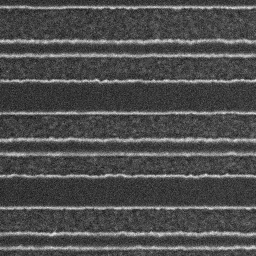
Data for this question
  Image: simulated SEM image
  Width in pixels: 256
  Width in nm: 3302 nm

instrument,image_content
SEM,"lines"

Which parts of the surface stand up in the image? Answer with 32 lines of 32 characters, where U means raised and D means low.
UUUUUUUUUUUUUUUUUUUUUUUUUUUUUUUU
DDDDDDDDDDDDDDDDDDDDDDDDDDDDDDDD
DDDDDDDDDDDDDDDDDDDDDDDDDDDDDDDD
DDDDDDDDDDDDDDDDDDDDDDDDDDDDDDDD
DDDDDDDDDDDDDDDDDDDDDDDDDDDDDDDD
UUUUUUUUUUUUUUUUUUUUUUUUUUUUUUUU
UUUUUUUUUUUUUUUUUUUUUUUUUUUUUUUU
DDDDDDDDDDDDDDDDDDDDDDDDDDDDDDDD
DDDDDDDDDDDDDDDDDDDDDDDDDDDDDDDD
DDDDDDDDDDDDDDDDDDDDDDDDDDDDDDDD
UUUUUUUUUUUUUUUUUUUUUUUUUUUUUUUU
UUUUUUUUUUUUUUUUUUUUUUUUUUUUUUUU
UUUUUUUUUUUUUUUUUUUUUUUUUUUUUUUU
UUUUUUUUUUUUUUUUUUUUUUUUUUUUUUUU
DDDDDDDDDDDDDDDDDDDDDDDDDDDDDDDD
DDDDDDDDDDDDDDDDDDDDDDDDDDDDDDDD
DDDDDDDDDDDDDDDDDDDDDDDDDDDDDDDD
UUUUUUUUUUUUUUUUUUUUUUUUUUUUUUUU
UUUUUUUUUUUUUUUUUUUUUUUUUUUUUUUU
DDDDDDDDDDDDDDDDDDDDDDDDDDDDDDDD
DDDDDDDDDDDDDDDDDDDDDDDDDDDDDDDD
DDDDDDDDDDDDDDDDDDDDDDDDDDDDDDDD
UUUUUUUUUUUUUUUUUUUUUUUUUUUUUUUU
UUUUUUUUUUUUUUUUUUUUUUUUUUUUUUUU
UUUUUUUUUUUUUUUUUUUUUUUUUUUUUUUU
UUUUUUUUUUUUUUUUUUUUUUUUUUUUUUUU
DDDDDDDDDDDDDDDDDDDDDDDDDDDDDDDD
DDDDDDDDDDDDDDDDDDDDDDDDDDDDDDDD
DDDDDDDDDDDDDDDDDDDDDDDDDDDDDDDD
UUUUUUUUUUUUUUUUUUUUUUUUUUUUUUUU
UUUUUUUUUUUUUUUUUUUUUUUUUUUUUUUU
DDDDDDDDDDDDDDDDDDDDDDDDDDDDDDDD